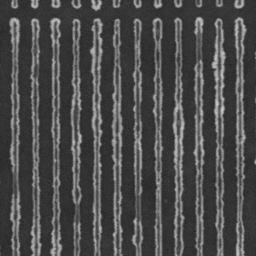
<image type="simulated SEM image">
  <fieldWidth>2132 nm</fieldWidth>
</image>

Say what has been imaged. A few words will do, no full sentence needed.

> parallel lines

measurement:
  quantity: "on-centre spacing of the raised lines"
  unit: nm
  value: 170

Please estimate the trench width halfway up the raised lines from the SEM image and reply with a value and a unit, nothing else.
110 nm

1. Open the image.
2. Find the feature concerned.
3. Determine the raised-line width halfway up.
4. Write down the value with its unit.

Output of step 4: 55.2 nanometres